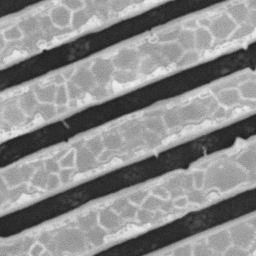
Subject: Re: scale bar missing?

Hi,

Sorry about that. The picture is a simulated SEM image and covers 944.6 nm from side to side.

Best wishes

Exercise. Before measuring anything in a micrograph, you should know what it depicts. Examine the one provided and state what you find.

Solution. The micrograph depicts one or a few lines or trenches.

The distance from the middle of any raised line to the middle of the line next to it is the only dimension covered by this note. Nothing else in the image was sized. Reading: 252 nanometres